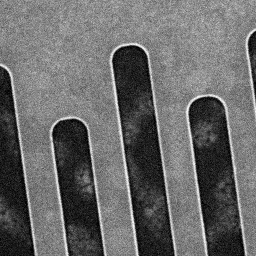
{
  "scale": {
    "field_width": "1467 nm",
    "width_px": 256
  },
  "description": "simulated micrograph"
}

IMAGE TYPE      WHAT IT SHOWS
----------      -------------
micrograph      one or a few lines or trenches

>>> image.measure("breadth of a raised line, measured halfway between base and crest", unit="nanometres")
186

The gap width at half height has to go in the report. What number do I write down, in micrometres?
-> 0.208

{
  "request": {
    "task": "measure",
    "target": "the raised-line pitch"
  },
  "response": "395 nm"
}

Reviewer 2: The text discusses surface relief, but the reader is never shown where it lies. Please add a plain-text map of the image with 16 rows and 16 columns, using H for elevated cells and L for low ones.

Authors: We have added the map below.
HHHHHHHHHHHHHHHH
HHHHHHHHHHHHHHHH
HHHHHHHHHHHHHHHH
HHHHHHHLLHHHHHHH
HHHHHHHLLHHHHHHH
LHHHHHHLLLHHHHHH
LHHHHHHLLLHHLLHH
LHHHLHHLLLHHLLHH
LHHLLLHHLLHHLLHH
LHHLLLHHLLHHLLHH
LLHLLLHHLLHHLLLH
LLHHLLHHLLHHLLLH
LLHHLLHHLLLHLLLH
LLHHLLHHLLLHHLLH
LLHHLLHHLLLHHLLH
LLHHLLLHHLLHHLLH